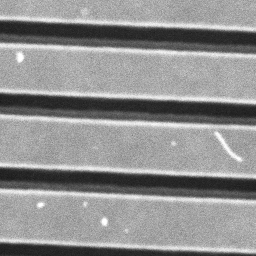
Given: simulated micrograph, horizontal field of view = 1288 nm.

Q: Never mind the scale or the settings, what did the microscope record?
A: lines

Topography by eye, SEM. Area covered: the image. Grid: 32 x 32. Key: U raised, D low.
UUUUUUUUUUUUUUUUUUUUUUUUUUUUUUUU
UUUUUUUUUUUUUUUUUUUUUUUUUUUUUUUU
DDUUUUUUUUUUUUUUUUUUUUUUUUUUUUUU
DDDDDDDDDDDDDDDDDDDDDDDDDUUUUUUU
DDDDDDDDDDDDDDDDDDDDDDDDDDDDDDDD
UUUUDDDDDDDDDDDDDDDDDDDDDDDDDDDD
UUUUUUUUUUUUUUUUUUUUUUUUUUDDDDDD
UUUUUUUUUUUUUUUUUUUUUUUUUUUUUUUU
UUUUUUUUUUUUUUUUUUUUUUUUUUUUUUUU
UUUUUUUUUUUUUUUUUUUUUUUUUUUUUUUU
UUUUUUUUUUUUUUUUUUUUUUUUUUUUUUUU
UUUUUUUUUUUUUUUUUUUUUUUUUUUUUUUU
DDDDDDDDDDDDDDDDDDDDDDUUUUUUUUUU
DDDDDDDDDDDDDDDDDDDDDDDDDDDDDDDD
UUUDDDDDDDDDDDDDDDDDDDDDDDDDDDDD
UUUUUUUUUUUUUUUUUUUUUUUUUDDDDDDD
UUUUUUUUUUUUUUUUUUUUUUUUUUUUUUUU
UUUUUUUUUUUUUUUUUUUUUUUUUUUUUUUU
UUUUUUUUUUUUUUUUUUUUUUUUUUUUUUUU
UUUUUUUUUUUUUUUUUUUUUUUUUUUUUUUU
UUUUUUUUUUUUUUUUUUUUUUUUUUUUUUUU
DDDDDDDDDDDDDUUUUUUUUUUUUUUUUUUU
DDDDDDDDDDDDDDDDDDDDDDDDDDDDDDDD
DDDDDUUUUDDDDDDDDDDDDDDDDDDDDDDD
UUUUUUUUUUUUUUUUUUUUDDDDDDDDDDDD
UUUUUUUUUUUUUUUUUUUUUUUUUUUUUUUU
UUUUUUUUUUUUUUUUUUUUUUUUUUUUUUUU
UUUUUUUUUUUUUUUUUUUUUUUUUUUUUUUU
UUUUUUUUUUUUUUUUUUUUUUUUUUUUUUUU
UUUUUUUUUUUUUUUUUUUUUUUUUUUUUUUU
DDDDDDUUUUUUUUUUUUUUUUUUUUUUUUUU
DDDDDDDDDDDDDDDDDDDDDDDDDDDDDUUU